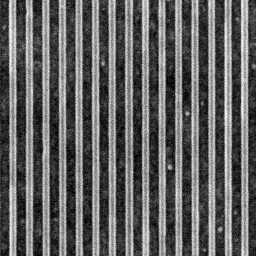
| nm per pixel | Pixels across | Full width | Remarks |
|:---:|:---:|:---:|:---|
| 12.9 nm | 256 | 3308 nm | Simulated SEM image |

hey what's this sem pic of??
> parallel lines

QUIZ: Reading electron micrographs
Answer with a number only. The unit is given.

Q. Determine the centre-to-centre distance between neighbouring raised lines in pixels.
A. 16.6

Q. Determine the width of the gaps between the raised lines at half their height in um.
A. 0.134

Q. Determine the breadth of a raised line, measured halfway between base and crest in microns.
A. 0.0808